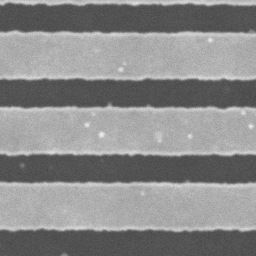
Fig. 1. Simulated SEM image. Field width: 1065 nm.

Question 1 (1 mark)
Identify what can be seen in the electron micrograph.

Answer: lines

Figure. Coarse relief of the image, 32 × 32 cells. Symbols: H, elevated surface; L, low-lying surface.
HLLHHHHHLHHHHHHHHHHHHHHLHHHHHHHH
LLLLLLLLLLLLLLLLLLLLLLLLLLLLLLLL
LLLLLLLLLLLLLLLLLLLLLLLLLLLLLLLL
LLLLLLLLLLLLLLLLLLLLLLLLLLLLLLLL
HHHHHHHHHHHHHHHHHHHHHHHHHHHHHHHH
HHHHHHHHHHHHHHHHHHHHHHHHHHHHHHHH
HHHHHHHHHHHHHHHHHHHHHHHHHHHHHHHH
HHHHHHHHHHHHHHHHHHHHHHHHHHHHHHHH
HHHHHHHHHHHHHHHHHHHHHHHHHHHHHHHH
HHHHHHHHHHHHHHHHHHHHHHHHHHHHHHHH
LLLLLLLLLLLLLLLLLLLLLLLLLLLLLLLL
LLLLLLLLLLLLLLLLLLLLLLLLLLLLLLLL
LLLLLLLLLLLLLLLLLLLLLLLLLLLLLLLL
HHHLHHHHHHHHHHHHHHHHHHHLHHHLHHHH
HHHHHHHHHHHHHHHHHHHHHHHHHHHHHHHH
HHHHHHHHHHHHHHHHHHHHHHHHHHHHHHHH
HHHHHHHHHHHHHHHHHHHHHHHHHHHHHHHH
HHHHHHHHHHHHHHHHHHHHHHHHHHHHHHHH
HHHHHHHHHHHHHHHHHHHHHHHHHHHHHHHH
LLLLLLLLLLLLLLLLLLLLLLLLLLLLLLLL
LLLLLLLLLLLLLLLLLLLLLLLLLLLLLLLL
LLLLLLLLLLLLLLLLLLLLLLLLLLLLLLLL
LLLLLLLLLLLLLLLLLLLLLLLLLLLLLLLL
HHHHHHHHHHHHHHHHHHHHHHHHHHHHHHHH
HHHHHHHHHHHHHHHHHHHHHHHHHHHHHHHH
HHHHHHHHHHHHHHHHHHHHHHHHHHHHHHHH
HHHHHHHHHHHHHHHHHHHHHHHHHHHHHHHH
HHHHHHHHHHHHHHHHHHHHHHHHHHHHHHHH
HHHHHHHHHHHHHHHHHHHHHHHHHHHHHHHH
LLLLLLLLLLLLLLLLLLLLLLLLLLLLLLLL
LLLLLLLLLLLLLLLLLLLLLLLLLLLLLLLL
LLLLLLLLLLLLLLLLLLLLLLLLLLLLLLLL